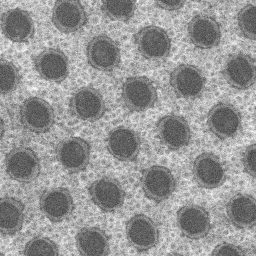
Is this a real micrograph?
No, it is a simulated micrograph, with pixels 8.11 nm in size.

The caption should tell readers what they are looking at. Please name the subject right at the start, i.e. a regular array of raised bodies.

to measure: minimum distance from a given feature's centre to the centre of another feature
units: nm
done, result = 418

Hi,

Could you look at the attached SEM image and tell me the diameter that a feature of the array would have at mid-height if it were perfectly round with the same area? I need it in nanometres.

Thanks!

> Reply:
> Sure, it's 248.